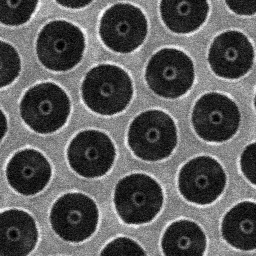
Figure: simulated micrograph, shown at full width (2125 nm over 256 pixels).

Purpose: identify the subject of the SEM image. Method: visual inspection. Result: a regular array of ring-shaped grooves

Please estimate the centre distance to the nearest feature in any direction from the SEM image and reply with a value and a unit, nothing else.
531 nanometers